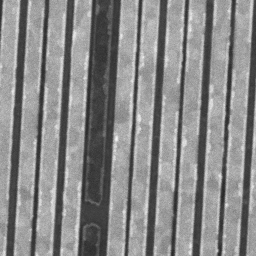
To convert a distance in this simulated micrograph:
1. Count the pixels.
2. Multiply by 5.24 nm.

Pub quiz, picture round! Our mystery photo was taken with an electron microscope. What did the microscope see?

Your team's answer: parallel lines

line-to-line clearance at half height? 40.5 nanometres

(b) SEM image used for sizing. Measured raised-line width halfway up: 16.5 px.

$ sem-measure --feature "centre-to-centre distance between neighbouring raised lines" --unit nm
121